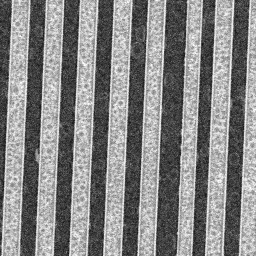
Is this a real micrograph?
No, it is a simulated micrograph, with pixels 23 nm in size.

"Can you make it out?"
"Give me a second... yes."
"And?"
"parallel lines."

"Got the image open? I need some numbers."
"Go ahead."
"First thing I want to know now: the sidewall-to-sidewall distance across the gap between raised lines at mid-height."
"17 px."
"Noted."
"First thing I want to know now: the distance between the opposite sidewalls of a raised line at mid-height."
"391 nm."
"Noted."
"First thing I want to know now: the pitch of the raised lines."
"782 nanometers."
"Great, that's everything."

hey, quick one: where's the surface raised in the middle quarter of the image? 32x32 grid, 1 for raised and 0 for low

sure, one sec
00001111000011110000011110000011
00001111000011110000011110000011
00001111000011110000111110000011
00011111000011110000111100000011
00011110000011110000111100000011
00011110000011110000111100000011
00011110000011110000111100000011
00011110000011110000111100000011
00011110000011110000111100000011
00011110000011110000111100000011
00011110000011110000111100000011
00011110000011110000111100000011
00011110000011110000111100000011
00011110000011110000111100000011
00011110000011110000111100000011
00011110000111100000111100000011
00011110000111100000111100000011
00011110000111100000111100000011
00011110000111100000111100000011
00011110000111100000111100000011
00011110000111100000111100000111
00011110000111100000111100000111
00011110000111100000111100000111
00011110000111100000111100000111
00011110000111100000111100000111
00011110000111100000111100000111
00011110000111100001111100000111
00111100000111100001111000000111
00111100000111100001111000000111
00111100000111100001111000000111
00111100000111100001111000000111
00111100000111100001111000000111